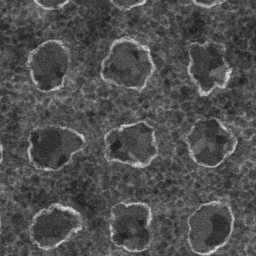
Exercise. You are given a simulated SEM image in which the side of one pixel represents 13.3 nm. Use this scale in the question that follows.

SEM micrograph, a regular array of raised bodies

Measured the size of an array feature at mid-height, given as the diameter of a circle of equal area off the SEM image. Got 637 nm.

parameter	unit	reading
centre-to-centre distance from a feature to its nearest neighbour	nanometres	1030